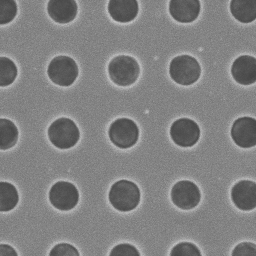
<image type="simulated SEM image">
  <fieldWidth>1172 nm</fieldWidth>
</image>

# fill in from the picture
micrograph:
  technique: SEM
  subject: a regular array of holes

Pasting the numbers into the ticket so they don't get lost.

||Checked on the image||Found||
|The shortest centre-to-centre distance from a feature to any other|278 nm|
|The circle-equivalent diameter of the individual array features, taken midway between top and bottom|140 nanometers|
